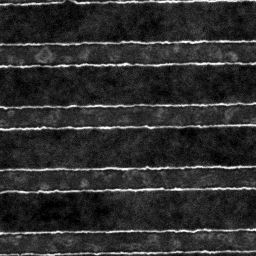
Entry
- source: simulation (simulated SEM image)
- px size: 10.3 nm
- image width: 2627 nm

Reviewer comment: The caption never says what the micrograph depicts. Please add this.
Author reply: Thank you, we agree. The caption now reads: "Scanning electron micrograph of parallel lines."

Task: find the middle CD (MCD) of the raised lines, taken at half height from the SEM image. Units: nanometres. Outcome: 428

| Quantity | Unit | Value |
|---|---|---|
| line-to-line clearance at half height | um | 0.214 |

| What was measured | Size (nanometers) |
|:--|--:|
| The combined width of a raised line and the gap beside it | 644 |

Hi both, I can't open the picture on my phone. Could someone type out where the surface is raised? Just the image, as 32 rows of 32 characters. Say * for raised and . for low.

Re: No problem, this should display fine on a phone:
.*..****************************
********************************
********************************
********************************
********************************
**********......................
.....*..........................
.....*..........................
********************************
********************************
********************************
********************************
********************************
................................
................................
................................
********************************
********************************
********************************
********************************
********************************
................................
................................
..............................*.
********************************
********************************
********************************
********************************
********************************
................................
................................
......................*.********